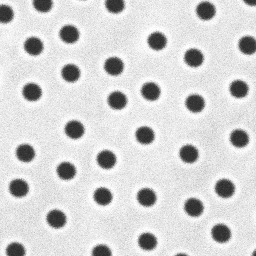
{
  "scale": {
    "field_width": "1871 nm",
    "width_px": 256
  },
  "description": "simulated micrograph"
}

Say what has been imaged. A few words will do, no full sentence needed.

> a regular array of holes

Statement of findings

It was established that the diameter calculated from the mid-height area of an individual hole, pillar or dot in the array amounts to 150 nm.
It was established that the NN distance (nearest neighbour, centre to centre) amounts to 296 nm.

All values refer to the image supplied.